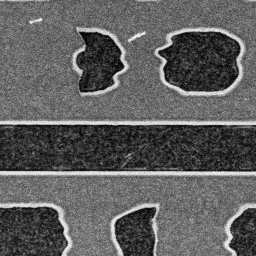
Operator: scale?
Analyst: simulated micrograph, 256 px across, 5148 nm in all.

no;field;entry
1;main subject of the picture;one or a few lines or trenches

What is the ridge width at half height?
660 nm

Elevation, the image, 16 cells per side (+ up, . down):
++++++++++++++++
++++++++++++++++
+++++..++++....+
+++++...++.....+
+++++...++.....+
+++++..++++...++
++++++++++++++++
++++++++++++++++
................
................
................
++++++++++++++++
++++++++++++++++
....++++..+++++.
....+++...++++..
....+++...++++..